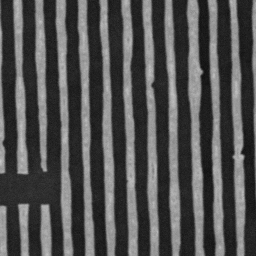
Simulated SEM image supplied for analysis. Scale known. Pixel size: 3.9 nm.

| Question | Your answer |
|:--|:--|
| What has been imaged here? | parallel lines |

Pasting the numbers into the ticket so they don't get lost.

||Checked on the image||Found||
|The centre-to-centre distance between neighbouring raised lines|84.4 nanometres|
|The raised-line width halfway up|0.0312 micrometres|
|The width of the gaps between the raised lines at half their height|14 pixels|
